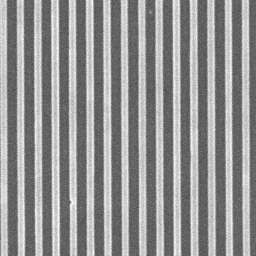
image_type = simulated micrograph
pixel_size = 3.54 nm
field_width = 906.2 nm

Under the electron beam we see parallel lines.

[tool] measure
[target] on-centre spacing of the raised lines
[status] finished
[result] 61.1 nm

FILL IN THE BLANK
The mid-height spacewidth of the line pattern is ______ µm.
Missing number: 0.0398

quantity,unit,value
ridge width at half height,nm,19.9